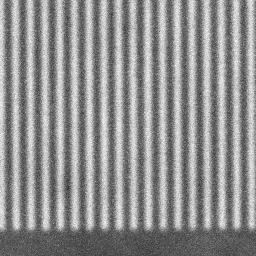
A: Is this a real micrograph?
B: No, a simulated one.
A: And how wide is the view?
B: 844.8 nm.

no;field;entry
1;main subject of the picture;parallel lines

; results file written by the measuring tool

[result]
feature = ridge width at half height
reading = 3.88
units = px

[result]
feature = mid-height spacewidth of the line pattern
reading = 34.7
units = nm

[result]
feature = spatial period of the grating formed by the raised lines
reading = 48.6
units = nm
